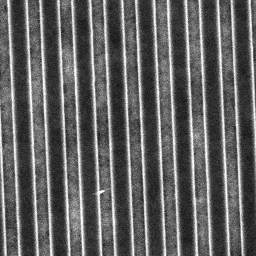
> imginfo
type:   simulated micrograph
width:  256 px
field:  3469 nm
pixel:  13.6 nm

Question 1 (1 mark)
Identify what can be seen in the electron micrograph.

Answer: parallel lines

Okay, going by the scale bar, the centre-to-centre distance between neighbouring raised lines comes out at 432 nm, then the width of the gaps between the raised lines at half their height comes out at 169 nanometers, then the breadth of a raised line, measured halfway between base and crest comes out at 259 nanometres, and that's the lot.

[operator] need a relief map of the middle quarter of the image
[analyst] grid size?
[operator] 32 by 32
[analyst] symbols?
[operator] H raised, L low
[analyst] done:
LLLHHHHLLLLHHHHLLLLHHHHLLLLHHHHL
LLLHHHHLLLLHHHHLLLLHHHHLLLLHHHHL
LLLHHHHLLLLHHHHLLLLHHHHLLLLHHHHL
LLLHHHHLLLLHHHHLLLLHHHHLLLLHHHHL
LLLHHHHLLLLHHHHHLLLHHHHLLLLHHHHL
LLLHHHHLLLLHHHHHLLLHHHHLLLLHHHHL
LLLHHHHHLLLHHHHHLLLHHHHHLLLHHHHL
LLLHHHHHLLLHHHHHLLLHHHHHLLLHHHHL
LLLHHHHHLLLHHHHHLLLHHHHHLLLHHHHL
LLLHHHHHLLLHHHHHLLLHHHHHLLLHHHHH
LLLHHHHHLLLHHHHHLLLHHHHHLLLHHHHH
LLLHHHHHLLLHHHHHLLLHHHHHLLLHHHHH
LLLHHHHHLLLHHHHHLLLHHHHHLLLHHHHH
LLLHHHHHLLLHHHHHLLLHHHHHLLLHHHHH
LLLHHHHHLLLHHHHHLLLHHHHHLLLHHHHH
LLLHHHHHLLLHHHHHLLLHHHHHLLLHHHHH
LLLHHHHHLLLLHHHHLLLHHHHHLLLHHHHH
LLLHHHHHLLLLHHHHLLLHHHHHLLLHHHHH
LLLHHHHHLLLLHHHHLLLHHHHHLLLHHHHH
LLLLHHHHLLLLHHHHLLLLHHHHLLLHHHHH
LLLLHHHHLLLLHHHHLLLLHHHHLLLHHHHH
LLLLHHHHLLLLHHHHLLLLHHHHLLLHHHHH
LLLLHHHHLLLLHHHHLLLLHHHHLLLLHHHH
LLLLHHHHLLLLHHHHLLLLHHHHLLLLHHHH
LLLLHHHHLLLLHHHHLLLLHHHHLLLLHHHH
LLLLHHHHLLLLHHHHLLLLHHHHLLLLHHHH
LLLLHHHHLLLLHHHHHLLLHHHHLLLLHHHH
HLLLHHHHLLLLHHHHHLLLHHHHLLLLHHHH
HLLLHHHHLLLLHHHHHLLLHHHHLLLLHHHH
HLLLHHHHHLLLHHHHHLLLHHHHHLLLHHHH
HLLLHHHHHLLLHHHHHLLLHHHHHLLLHHHH
HLLLHHHHHLLLHHHHHLLLHHHHHLLLHHHH